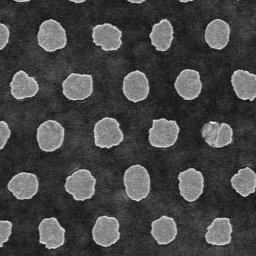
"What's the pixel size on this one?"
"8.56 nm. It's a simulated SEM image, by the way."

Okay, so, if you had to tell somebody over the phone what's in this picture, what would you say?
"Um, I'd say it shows a regular array of raised bodies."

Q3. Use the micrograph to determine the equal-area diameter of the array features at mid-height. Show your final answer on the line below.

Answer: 241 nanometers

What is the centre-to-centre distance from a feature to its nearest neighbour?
461 nm